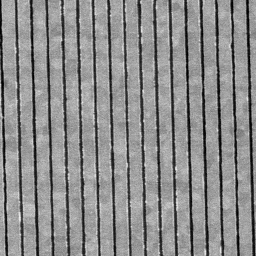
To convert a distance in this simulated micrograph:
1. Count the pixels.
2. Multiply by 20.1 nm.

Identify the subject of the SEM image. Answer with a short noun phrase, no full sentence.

parallel lines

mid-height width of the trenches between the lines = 72.9 nanometres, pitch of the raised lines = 310 nm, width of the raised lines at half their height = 236 nm